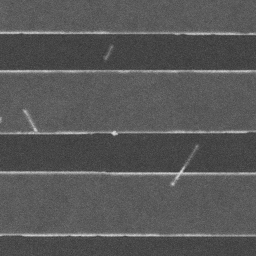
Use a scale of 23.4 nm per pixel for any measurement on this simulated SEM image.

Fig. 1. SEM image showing lines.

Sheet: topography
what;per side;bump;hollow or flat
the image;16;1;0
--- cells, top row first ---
1111111111111111
1111111111111111
0000000000000000
0000000000000000
1111111111111111
1111111111111111
1111111111111111
1111111111111111
0000000000000000
0000000000000000
0000000000000000
1111111111111111
1111111111111111
1111111111111111
1111111111111111
0000000000000000